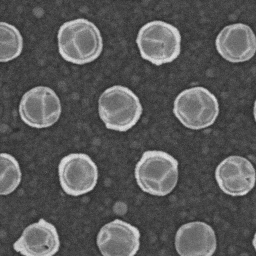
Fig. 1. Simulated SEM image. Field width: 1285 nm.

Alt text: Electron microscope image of a regular array of raised bodies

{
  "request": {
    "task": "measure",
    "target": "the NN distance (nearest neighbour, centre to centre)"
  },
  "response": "0.381 µm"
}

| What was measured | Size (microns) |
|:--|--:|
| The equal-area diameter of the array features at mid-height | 0.211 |